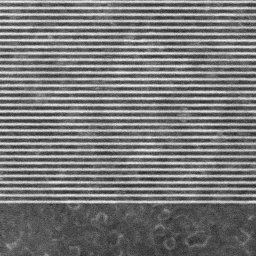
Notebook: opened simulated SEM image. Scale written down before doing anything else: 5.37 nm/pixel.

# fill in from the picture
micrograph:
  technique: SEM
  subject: parallel lines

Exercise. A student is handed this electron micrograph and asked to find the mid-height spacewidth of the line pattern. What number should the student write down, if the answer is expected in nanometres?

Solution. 25.5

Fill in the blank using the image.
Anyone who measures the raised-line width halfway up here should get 1.88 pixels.